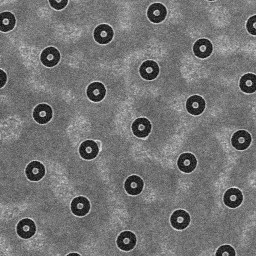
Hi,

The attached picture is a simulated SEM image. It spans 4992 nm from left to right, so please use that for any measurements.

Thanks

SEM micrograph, a regular array of ring-shaped grooves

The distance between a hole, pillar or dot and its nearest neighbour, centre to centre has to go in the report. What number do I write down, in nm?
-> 1120